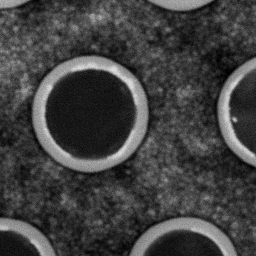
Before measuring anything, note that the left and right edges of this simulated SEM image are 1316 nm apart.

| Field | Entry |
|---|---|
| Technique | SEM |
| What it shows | raised bodies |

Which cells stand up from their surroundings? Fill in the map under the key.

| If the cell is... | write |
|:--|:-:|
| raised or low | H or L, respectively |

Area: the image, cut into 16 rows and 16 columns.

LLLLLLLLLLLLLLLL
LLLLLLLLLLLLLLLL
LLLLLLLLLLLLLLLL
LLLLLLLLLLLLLLLL
LLLLHHHHLLLLLLLH
LLLHHHHHHLLLLLHH
LLHHHHHHHLLLLLHH
LLHHHHHHHLLLLLHH
LLLHHHHHHLLLLLHH
LLLHHHHHLLLLLLLH
LLLLLLLLLLLLLLLL
LLLLLLLLLLLLLLLL
LLLLLLLLLLLLLLLL
LLLLLLLLLLLLLLLL
HHLLLLLLLLHHHLLL
HHHLLLLLLHHHHHLL